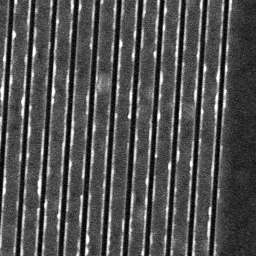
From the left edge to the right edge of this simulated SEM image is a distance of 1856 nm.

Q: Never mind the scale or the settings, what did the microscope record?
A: parallel lines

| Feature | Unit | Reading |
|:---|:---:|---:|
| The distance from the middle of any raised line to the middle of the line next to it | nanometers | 156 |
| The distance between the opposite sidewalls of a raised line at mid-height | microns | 0.117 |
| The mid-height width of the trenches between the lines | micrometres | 0.0389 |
